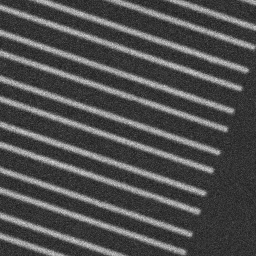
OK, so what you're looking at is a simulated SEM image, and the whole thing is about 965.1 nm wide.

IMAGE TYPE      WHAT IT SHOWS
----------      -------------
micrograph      parallel lines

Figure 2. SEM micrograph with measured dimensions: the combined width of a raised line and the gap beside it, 80.8 nm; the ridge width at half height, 0.0174 micrometres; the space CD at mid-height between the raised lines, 55.7 nm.